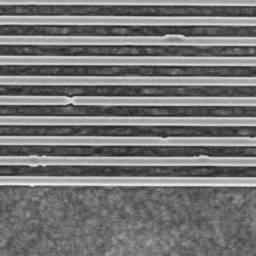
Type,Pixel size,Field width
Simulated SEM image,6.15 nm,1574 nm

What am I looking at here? parallel lines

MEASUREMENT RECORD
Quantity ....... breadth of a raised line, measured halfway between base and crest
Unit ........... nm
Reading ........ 53.8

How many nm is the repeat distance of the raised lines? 123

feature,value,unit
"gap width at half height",0.0723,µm